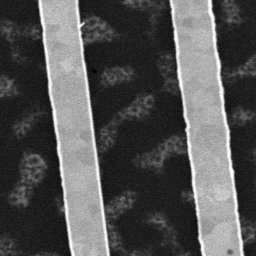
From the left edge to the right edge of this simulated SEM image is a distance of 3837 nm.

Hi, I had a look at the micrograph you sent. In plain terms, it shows one or a few lines or trenches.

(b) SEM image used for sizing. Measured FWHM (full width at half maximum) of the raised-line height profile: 558 nm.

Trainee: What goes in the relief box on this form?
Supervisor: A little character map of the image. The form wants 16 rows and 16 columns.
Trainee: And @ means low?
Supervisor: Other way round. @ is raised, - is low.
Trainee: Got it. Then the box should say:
---@@------@@---
---@@------@@---
---@@------@@---
---@@------@@@--
---@@------@@@--
---@@------@@@--
---@@@------@@--
---@@@------@@--
----@@------@@--
----@@------@@--
----@@------@@--
----@@------@@@-
----@@------@@@-
----@@------@@@-
----@@@-----@@@-
----@@@------@@-